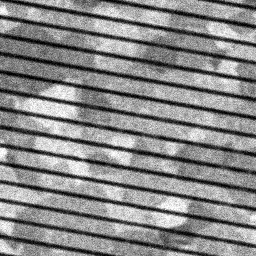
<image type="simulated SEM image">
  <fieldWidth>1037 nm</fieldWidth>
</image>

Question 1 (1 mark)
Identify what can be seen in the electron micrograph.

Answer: parallel lines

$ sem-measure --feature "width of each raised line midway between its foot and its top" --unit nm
51.4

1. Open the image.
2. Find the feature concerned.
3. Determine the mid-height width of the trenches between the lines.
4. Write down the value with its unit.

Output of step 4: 4.79 pixels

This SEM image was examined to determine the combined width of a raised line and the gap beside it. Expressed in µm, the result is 0.0729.